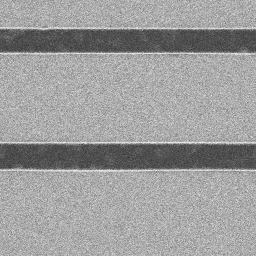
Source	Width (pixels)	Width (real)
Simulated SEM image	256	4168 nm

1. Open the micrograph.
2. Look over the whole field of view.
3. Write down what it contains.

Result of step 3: one or a few lines or trenches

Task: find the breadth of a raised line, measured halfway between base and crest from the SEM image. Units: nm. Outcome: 444